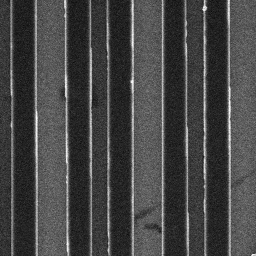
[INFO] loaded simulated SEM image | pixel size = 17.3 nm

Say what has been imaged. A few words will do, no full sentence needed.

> lines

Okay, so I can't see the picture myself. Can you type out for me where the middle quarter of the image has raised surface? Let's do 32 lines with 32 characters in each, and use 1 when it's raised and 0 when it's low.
11111110000111111000000001111110
11111110000111111000000001111110
11111110000111111000000001111110
11111110000111111000000001111110
11111110000111111000000001111110
11111110000111111000000001111110
11111110000111111000000001111110
11111110000111111000000001111110
11111110000111111000000001111110
01111110000111111000000001111110
01111110000111111000000001111110
01111110000111111000000001111110
01111110000111111000000001111110
01111110000111111000000001111110
01111110000111111000000001111110
01111110000111111000000001111110
01111110000111111000000001111110
01111110000111111000000001111110
01111110000111111000000001111110
01111110000111111000000001111110
01111110000111111000000001111110
01111110000111111000000001111110
01111110000111111000000001111110
01111110000111111000000001111110
01111110000111111000000001111110
01111110000111111000000001111110
01111110000111111000000001111110
01111110000111111000000001111110
01111110000111111000000001111110
01111110000111111000000001111110
01111110000111111000000001111110
01111110000111111000000001111110